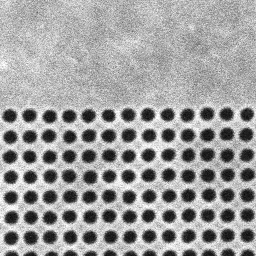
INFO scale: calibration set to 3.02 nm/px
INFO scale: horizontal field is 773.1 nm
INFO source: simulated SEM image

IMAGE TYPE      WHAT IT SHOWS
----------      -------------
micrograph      a regular array of holes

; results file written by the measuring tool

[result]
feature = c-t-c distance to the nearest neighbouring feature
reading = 58.4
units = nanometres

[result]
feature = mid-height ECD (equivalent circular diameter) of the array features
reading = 42.1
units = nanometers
